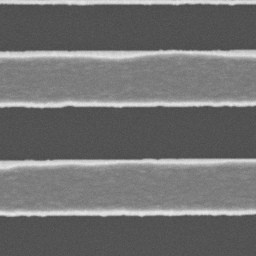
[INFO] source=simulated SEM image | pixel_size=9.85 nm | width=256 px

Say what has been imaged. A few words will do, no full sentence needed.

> lines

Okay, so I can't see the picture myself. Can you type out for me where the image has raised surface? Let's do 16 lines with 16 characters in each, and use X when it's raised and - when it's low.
----------------
----------------
----------------
XXXXXXXXXXXXXXXX
XXXXXXXXXXXXXXXX
XXXXXXXXXXXXXXXX
XXXXXXXXXXXXXXXX
----------------
----------------
----------------
XXXXXXXXXXXXXXXX
XXXXXXXXXXXXXXXX
XXXXXXXXXXXXXXXX
X-X-------------
----------------
----------------